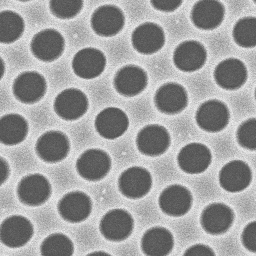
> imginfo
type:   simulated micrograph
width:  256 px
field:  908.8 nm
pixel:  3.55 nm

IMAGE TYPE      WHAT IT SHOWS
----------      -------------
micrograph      a regular array of holes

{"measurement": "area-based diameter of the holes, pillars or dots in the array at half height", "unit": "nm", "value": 115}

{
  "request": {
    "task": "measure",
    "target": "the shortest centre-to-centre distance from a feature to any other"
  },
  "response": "158 nm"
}